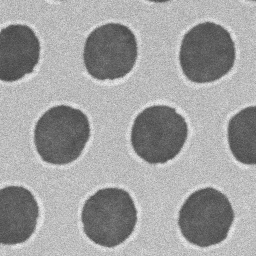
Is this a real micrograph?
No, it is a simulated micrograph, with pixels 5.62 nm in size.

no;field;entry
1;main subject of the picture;holes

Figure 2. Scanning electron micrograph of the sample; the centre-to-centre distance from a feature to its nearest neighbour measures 534 nm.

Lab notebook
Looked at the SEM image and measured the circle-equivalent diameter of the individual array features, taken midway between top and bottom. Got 321 nanometres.